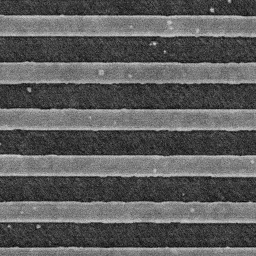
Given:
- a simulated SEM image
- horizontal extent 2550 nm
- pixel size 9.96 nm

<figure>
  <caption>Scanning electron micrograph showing lines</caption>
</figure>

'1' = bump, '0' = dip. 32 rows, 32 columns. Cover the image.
00000000000000000000000000000000
00000000000000000000000000000000
11111111111111111111111111111111
11111111111111111111111111111111
00000000000000000000000000000000
00000000000000000000000000000000
00000000000000000000000000000000
00000000000000000000000000000000
11111111111111111111111111111111
11111111111111111111111111111111
00000000000000000000000000000000
00000000000000000000000000000000
00000000000000000000000000000000
00000000000000000000000000000000
11111111111111111111111111111111
11111111111111111111111111111111
00000000000000000000000000000000
00000000000000000000000000000000
00000000000000000000000000000000
11100010000000000000000000000000
11111111111111111111111111111111
11111111111111111111111111111111
00000000000000000000000000000000
00000000000000000000000000000000
00000000000000000000000000000000
11111111111111111111111111111111
11111111111111111111111111111111
11111111111111111111111111111111
00000000000000000000000000000000
00000000000000000000000000000000
00000000000000000000000000000000
11111111111111111111111111111111